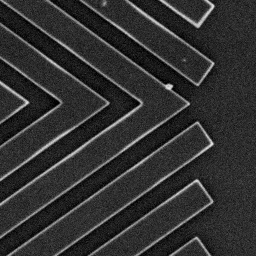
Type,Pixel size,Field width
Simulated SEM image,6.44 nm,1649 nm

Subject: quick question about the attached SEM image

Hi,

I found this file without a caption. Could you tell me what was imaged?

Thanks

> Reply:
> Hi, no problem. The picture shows groups of lines, slits or small figures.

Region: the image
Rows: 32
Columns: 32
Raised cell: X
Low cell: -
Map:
-XXXXXX----XXXXXX----XXXXX------
--XXXXXX----XXXXXX----XXXX------
---XXXXXX----XXXXXX----XX-------
X----XXXXXX----XXXXXX-----------
XX----XXXXXX----XXXXXX----------
XXXX----XXXXXX----XXXXX---------
XXXXX----XXXXXX----XXXXXX-------
XXXXXX----XXXXXX----XXXXXX------
--XXXXXX----XXXXXX----XXXX------
---XXXXXX----XXXXXX----XXX------
----XXXXXX----XXXXXX----X-------
XX----XXXXXX----XXXXXX----------
XXX----XXXXXX----XXXXXX---------
XXX----XXXXXX----XXXXXX---------
X----XXXXXXX----XXXXXX----------
----XXXXXX----XXXXXX----X-------
--XXXXXXX----XXXXXX----XXX------
-XXXXXX----XXXXXX----XXXXX------
XXXXXX----XXXXXX----XXXXXX------
XXXX-----XXXXXX----XXXXXX-------
XXX----XXXXXX----XXXXXX---------
XX----XXXXXX----XXXXXX----------
----XXXXXX----XXXXXX------------
---XXXXXX----XXXXXX----XX-------
-XXXXXX----XXXXXXX----XXXX------
XXXXXX----XXXXXX----XXXXXX------
XXXXX----XXXXXX----XXXXXX-------
XXX----XXXXXX----XXXXXXX--------
XX----XXXXXX----XXXXXX----------
----XXXXXXX---XXXXXXX-----------
---XXXXXX----XXXXXX----XX-------
--XXXXXX----XXXXXX----XXXX------